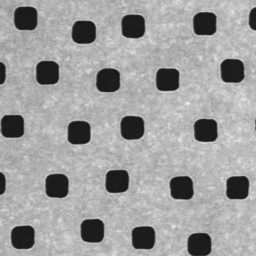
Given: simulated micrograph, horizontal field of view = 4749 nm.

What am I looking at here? a regular array of holes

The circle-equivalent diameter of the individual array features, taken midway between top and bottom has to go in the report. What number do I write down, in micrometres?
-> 0.47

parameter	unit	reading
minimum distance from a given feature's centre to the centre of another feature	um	1.02